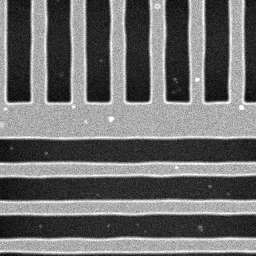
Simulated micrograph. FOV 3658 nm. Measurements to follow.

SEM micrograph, groups of lines, slits or small figures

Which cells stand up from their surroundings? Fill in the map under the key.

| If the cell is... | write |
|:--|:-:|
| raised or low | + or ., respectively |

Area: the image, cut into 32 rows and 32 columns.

+...++...++...++...++...++...++.
+...++...++...++...++...++...++.
+...++...++...+....++...++...+..
+...++...++...++...++...++...+..
+...++...++...++...++...++...++.
+...++...++...++...++...++...++.
+...++...++...++...++...++...++.
+...++...++...++...++...++...++.
+...++...++...++...++...+....++.
+...++...++...++...++...+....++.
+...++...++...++...++...+....++.
+...++...++...++...++...++...++.
+...++...++...++...++...++..+++.
++++++++++++++++++++++++++++++++
++++++++++++++++++++++++++++++++
++++++++++++++++++++++++++++++++
++++++++++++++++++++++++++++++++
................................
................................
................................
++++++++++++++++++++++++++++++++
++++++++++++++++++++++++++++++++
................................
................................
................................
++++++++++++++++++++++++++++++++
++++++++++++++++++++++++++++++++
................................
................................
................................
++++++++++++++++++++++++++++++++
+++++++++++++++++++++++++++++.++